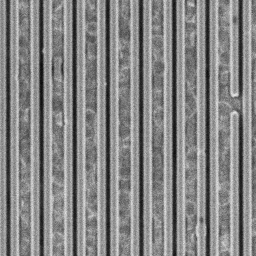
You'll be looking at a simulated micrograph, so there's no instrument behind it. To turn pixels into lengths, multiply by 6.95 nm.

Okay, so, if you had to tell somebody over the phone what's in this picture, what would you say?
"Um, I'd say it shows parallel lines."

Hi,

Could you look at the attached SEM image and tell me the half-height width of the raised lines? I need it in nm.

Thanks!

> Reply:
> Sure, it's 55.6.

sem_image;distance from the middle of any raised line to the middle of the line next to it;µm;0.116